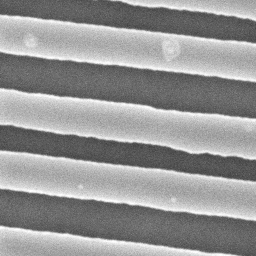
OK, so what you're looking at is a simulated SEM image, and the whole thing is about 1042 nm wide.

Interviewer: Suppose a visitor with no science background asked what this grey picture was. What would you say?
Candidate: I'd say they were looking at lines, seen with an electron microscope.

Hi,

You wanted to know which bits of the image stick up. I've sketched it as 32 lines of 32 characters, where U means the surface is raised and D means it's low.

DDDDDDDDDDDDDDDDUUUUUUUUUUUUUUUU
DDDDDDDDDDDDDDDDDDDDDDDDDDUUUUUU
UUUUUUDDDDDDDDDDDDDDDDDDDDDDDDDD
UUUUUUUUUUUUUUDDDDDDDDDDDDDDDDDD
UUUUUUUUUUUUUUUUUUUUUUUDDDDDDDDD
UUUUUUUUUUUUUUUUUUUUUUUUUUUUUUUU
DUUUUUUUUUUUUUUUUUUUUUUUUUUUUUUU
DDDDDDDDDUUUUUUUUUUUUUUUUUUUUUUU
DDDDDDDDDDDDDDDDDDUUUUUUUUUUUUUU
DDDDDDDDDDDDDDDDDDDDDDDDDDDUUUUU
DDDDDDDDDDDDDDDDDDDDDDDDDDDDDDDD
UUDDDDDDDDDDDDDDDDDDDDDDDDDDDDDD
UUUUUUUUUUUUDDDDDDDDDDDDDDDDDDDD
UUUUUUUUUUUUUUUUUUUDDDDDDDDDDDDD
UUUUUUUUUUUUUUUUUUUUUUUUUUUUDDDD
UUUUUUUUUUUUUUUUUUUUUUUUUUUUUUUU
DDDDDDDUUUUUUUUUUUUUUUUUUUUUUUUU
DDDDDDDDDDDDDDUUUUUUUUUUUUUUUUUU
DDDDDDDDDDDDDDDDDDDDDDUUUUUUUUUU
UUUUUDDDDDDDDDDDDDDDDDDDDDDDUUUU
UUUUUUUUUUUUUUDDDDDDDDDDDDDDDDDD
UUUUUUUUUUUUUUUUUUUUUUDDDDDDDDDD
UUUUUUUUUUUUUUUUUUUUUUUUUUUUUUDD
UUUUUUUUUUUUUUUUUUUUUUUUUUUUUUUU
DDDDDDDDUUUUUUUUUUUUUUUUUUUUUUUU
DDDDDDDDDDDDDDDDUUUUUUUUUUUUUUUU
DDDDDDDDDDDDDDDDDDDDDDDDUUUUUUUU
DDDDDDDDDDDDDDDDDDDDDDDDDDDDDDDD
UDDDDDDDDDDDDDDDDDDDDDDDDDDDDDDD
UUUUUUUUUDDDDDDDDDDDDDDDDDDDDDDD
UUUUUUUUUUUUUUUUUUDDDDDDDDDDDDDD
UUUUUUUUUUUUUUUUUUUUUUUUUDDDDDDD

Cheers